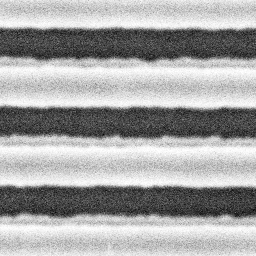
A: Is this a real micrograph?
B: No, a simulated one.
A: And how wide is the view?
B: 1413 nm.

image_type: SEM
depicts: lines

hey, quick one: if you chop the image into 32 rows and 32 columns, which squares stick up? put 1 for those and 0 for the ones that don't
11111111111111111111111111111111
11111111111111111111111111111111
11111111111111111111111111111111
00000000000000000000000000110100
00000000000000000000000000000000
00000000000000000000000000000000
00000000000000000000000000000000
11110000100000001000000100000000
11111111111111111111111111111111
11111111111111111111111111111111
11111111111111111111111111111111
11111111111111111111111111111111
11111111111111111111111111111111
00000000000000000000000000000000
00000000000000000000000000000000
00000000000000000000000000000000
00000000000000000000000000000000
11111111111101100100111111100000
11111111111111111111111111111111
11111111111111111111111111111111
11111111111111111111111111111111
11111111111111111111111111111111
11111111111111111111111111111111
00000000000000000000000000000000
00000000000000000000000000000000
00000000000000000000000000000000
00000000000000000000000000000000
11111110011111111111100111111001
11111111111111111111111111111111
11111111111111111111111111111111
11111111111111111111111111111111
11111111111111111111111111111111